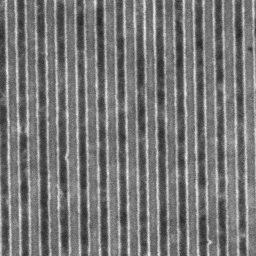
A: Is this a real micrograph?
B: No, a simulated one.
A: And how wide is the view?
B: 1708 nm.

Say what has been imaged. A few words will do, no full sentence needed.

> parallel lines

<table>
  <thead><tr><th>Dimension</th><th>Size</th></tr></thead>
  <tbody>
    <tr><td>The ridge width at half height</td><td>71.7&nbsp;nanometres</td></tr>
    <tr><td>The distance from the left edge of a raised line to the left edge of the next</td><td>19.8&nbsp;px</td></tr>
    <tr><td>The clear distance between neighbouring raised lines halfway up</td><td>8.88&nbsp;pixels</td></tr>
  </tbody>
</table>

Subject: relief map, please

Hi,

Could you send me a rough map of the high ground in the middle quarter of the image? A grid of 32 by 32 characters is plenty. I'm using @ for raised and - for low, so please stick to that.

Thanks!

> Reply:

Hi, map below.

@--@@---@@---@@---@@---@@---@@--
@--@@---@@@--@@---@@---@@---@@--
@--@@---@@@--@@@--@@---@@---@@--
@--@@---@@@--@@@--@@---@@---@@--
@--@@---@@@--@@@--@@---@@---@@--
@--@@@--@@@--@@@--@@---@@---@@--
@--@@@--@@---@@---@@---@@---@@--
@--@@@--@@---@@@--@@@--@@---@@--
@--@@@--@@---@@@--@@@--@@---@@--
@--@@@--@@---@@@--@@@--@@---@@--
@--@@@--@@@--@@---@@@--@@---@@--
@--@@@--@@@--@@---@@@--@@---@@--
@--@@@--@@@--@@---@@@--@@@--@@--
@--@@@--@@@--@@@--@@@--@@@--@@--
@--@@@--@@@--@@@--@@@--@@@--@@--
@--@@@--@@@--@@@--@@@--@@@--@@--
@--@@@--@@@--@@@--@@@--@@@--@@--
@--@@@--@@@--@@@--@@@--@@@--@@@-
@--@@@--@@@--@@@--@@@--@@@--@@@-
@--@@@--@@@--@@@--@@@--@@@--@@@-
@---@@--@@@--@@@--@@@--@@@--@@@-
@--@@@--@@@--@@@--@@@--@@@--@@@-
@--@@@---@@--@@@--@@@--@@@--@@@-
@--@@@---@@--@@@--@@@--@@@--@@@-
@---@@---@@--@@@--@@@--@@@--@@@-
@--@@@---@@--@@@--@@@--@@@--@@@-
@--@@@---@@--@@@--@@@--@@@--@@@-
@--@@@---@@---@@--@@@--@@@--@@@-
@--@@@---@@---@@--@@@--@@@--@@@-
@---@@---@@---@@--@@@--@@@--@@@-
@---@@---@@---@@--@@@--@@@--@@@-
@---@@---@@---@@--@@@--@@@--@@@-